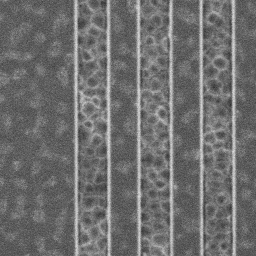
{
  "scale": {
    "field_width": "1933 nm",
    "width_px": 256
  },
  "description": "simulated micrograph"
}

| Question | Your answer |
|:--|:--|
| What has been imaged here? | parallel lines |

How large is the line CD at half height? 233 nm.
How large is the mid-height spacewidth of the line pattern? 0.24 micrometres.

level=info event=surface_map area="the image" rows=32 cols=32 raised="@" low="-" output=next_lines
@@@@@@@@@--@--@@@----@@@@----@@@
@@@@@@@@@-----@@@----@@@@----@@@
@@@@@@@@@---@-@@@----@@@@----@@@
@@@@@@@@@-----@@@----@@@@----@@@
@@@@@@@@@-----@@@----@@@@----@@@
@@@@@@@@@-----@@@----@@@@----@@@
@@@@@@@@@-----@@@----@@@@----@@@
@@@@@@@@@-----@@@----@@@@--@-@@@
@@@@@@@@@@----@@@----@@@@----@@@
@@@@@@@@@@----@@@----@@@@----@@@
@@@@@@@@@@----@@@----@@@@----@@@
@@@@@@@@@@----@@@----@@@@----@@@
@@@@@@@@@@----@@@----@@@@----@@@
@@@@@@@@@@----@@@----@@@@----@@@
@@@@@@@@@@----@@@----@@@@----@@@
@@@@@@@@@@----@@@----@@@@----@@@
@@@@@@@@@@----@@@----@@@@----@@@
@@@@@@@@@@----@@@----@@@@----@@@
@@@@@@@@@@----@@@----@@@@----@@@
@@@@@@@@@@----@@@----@@@@----@@@
@@@@@@@@@@----@@@----@@@@----@@@
@@@@@@@@@@----@@@----@@@@----@@@
@@@@@@@@@@----@@@----@@@@----@@@
@@@@@@@@@@----@@@----@@@@----@@@
@@@@@@@@@@----@@@----@@@@----@@@
@@@@@@@@@@----@@@----@@@@----@@@
@@@@@@@@@@----@@@----@@@@-@--@@@
@@@@@@@@@@----@@@----@@@@----@@@
@@@@@@@@@@----@@@----@@@@----@@@
@@@@@@@@@@----@@@----@@@@----@@@
@@@@@@@@@@----@@@----@@@@----@@@
@@@@@@@@@@----@@@-----@@@----@@@